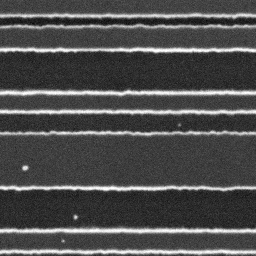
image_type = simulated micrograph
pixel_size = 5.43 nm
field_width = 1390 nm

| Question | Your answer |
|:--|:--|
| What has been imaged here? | lines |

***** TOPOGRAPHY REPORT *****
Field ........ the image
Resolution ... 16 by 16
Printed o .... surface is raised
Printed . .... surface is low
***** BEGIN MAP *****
oooooooooooooooo
oooooooooooooooo
oooooooooooooooo
................
................
................
oooooooooooooooo
oooooooooooooooo
oooooooooooooooo
oooooooooooooooo
oooooooooooooooo
oooooooooooooooo
................
................
oooooooooooooooo
oooooooooooooooo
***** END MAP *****